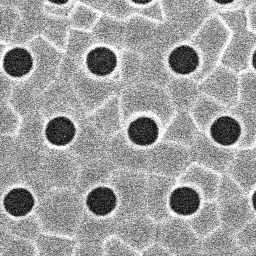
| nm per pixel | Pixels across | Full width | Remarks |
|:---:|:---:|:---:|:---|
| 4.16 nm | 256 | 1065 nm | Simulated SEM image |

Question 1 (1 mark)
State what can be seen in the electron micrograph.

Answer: a regular array of holes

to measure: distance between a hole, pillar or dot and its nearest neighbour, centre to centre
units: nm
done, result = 337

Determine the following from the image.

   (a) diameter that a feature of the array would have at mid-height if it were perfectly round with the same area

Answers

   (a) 125 nm